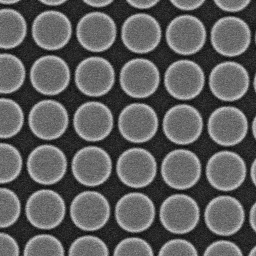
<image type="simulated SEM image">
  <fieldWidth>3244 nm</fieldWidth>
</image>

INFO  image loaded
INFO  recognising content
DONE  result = an array of small figures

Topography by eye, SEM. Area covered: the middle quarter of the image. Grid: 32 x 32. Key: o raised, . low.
o...oooooooo...oooooooo....ooooo
o..ooooooooo...oooooooo...oooooo
o..ooooooooo..ooooooooo..ooooooo
o..ooooooooo..oooooooooo.ooooooo
o..ooooooooo..oooooooooo.ooooooo
o..ooooooooo..ooooooooo..ooooooo
....ooooooo....oooooooo...oooooo
......oooo......oooooo.....ooooo
............................oooo
................................
....oooooo......ooooo.......ooo.
...oooooooo....ooooooo....oooooo
o..ooooooooo..ooooooooo...oooooo
o..ooooooooo..ooooooooo..ooooooo
o..ooooooooo..ooooooooo..ooooooo
o..ooooooooo..ooooooooo..ooooooo
...ooooooooo..ooooooooo..ooooooo
....ooooooo....ooooooo...ooooooo
.....ooooo.....ooooooo....oooooo
..................o........ooooo
................................
....ooooo.......oooo............
...oooooooo....oooooo.....oooooo
...oooooooo...oooooooo...ooooooo
..oooooooooo.oooooooooo..ooooooo
..oooooooooo.oooooooooo..ooooooo
..oooooooooo.oooooooooo.oooooooo
..ooooooooo...ooooooooo.oooooooo
...oooooooo...oooooooo...ooooooo
....oooooo.....oooooo.....oooooo
.................ooo.......ooooo
................................